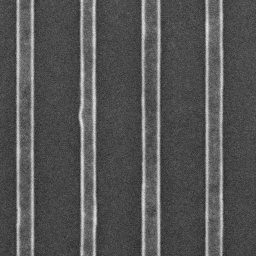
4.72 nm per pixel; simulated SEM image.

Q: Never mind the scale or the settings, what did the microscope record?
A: one or a few lines or trenches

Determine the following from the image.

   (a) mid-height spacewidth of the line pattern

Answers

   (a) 0.227 micrometres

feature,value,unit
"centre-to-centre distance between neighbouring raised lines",0.298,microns